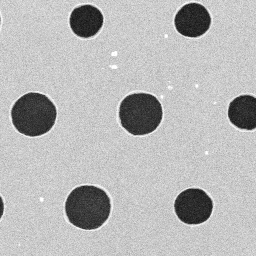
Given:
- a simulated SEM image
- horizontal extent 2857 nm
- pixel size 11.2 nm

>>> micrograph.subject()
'holes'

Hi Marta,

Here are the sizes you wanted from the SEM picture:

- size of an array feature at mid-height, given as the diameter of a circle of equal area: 470 nanometres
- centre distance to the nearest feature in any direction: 1190 nanometers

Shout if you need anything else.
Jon